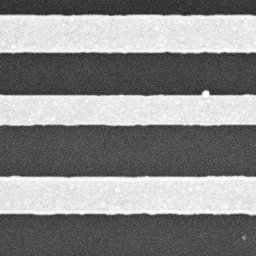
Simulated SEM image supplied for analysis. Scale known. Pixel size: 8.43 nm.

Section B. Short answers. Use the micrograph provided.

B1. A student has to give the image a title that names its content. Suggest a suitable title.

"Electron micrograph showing lines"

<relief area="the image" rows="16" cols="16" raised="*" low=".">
................
****************
****************
................
................
................
****************
****************
................
................
................
****************
****************
................
................
................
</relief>